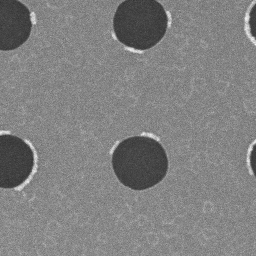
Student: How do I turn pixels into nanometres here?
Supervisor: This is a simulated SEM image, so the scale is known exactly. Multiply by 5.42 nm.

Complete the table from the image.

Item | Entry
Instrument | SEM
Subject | holes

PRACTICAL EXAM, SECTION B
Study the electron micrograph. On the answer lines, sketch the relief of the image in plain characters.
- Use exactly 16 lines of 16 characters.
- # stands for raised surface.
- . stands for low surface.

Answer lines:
..#####...######
..#####...######
..#####...######
################
################
################
################
################
.###############
..#####...######
..#####...######
.#######..######
################
################
################
################